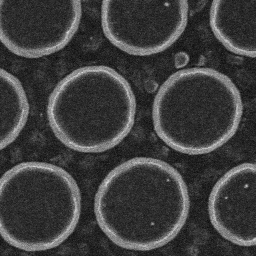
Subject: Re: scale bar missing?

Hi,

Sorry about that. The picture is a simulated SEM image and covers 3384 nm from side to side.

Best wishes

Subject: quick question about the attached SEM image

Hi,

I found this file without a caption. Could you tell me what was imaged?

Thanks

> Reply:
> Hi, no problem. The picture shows raised bodies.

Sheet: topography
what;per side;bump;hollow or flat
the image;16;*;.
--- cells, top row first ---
*****..****..***
*****..****..***
****...****...**
................
.....**.....*...
*...****..****..
*..*****..*****.
*..*****..*****.
*...****..****..
................
.**.....**.....*
****...****...**
*****.******.***
*****.*****..***
****...****...**
................